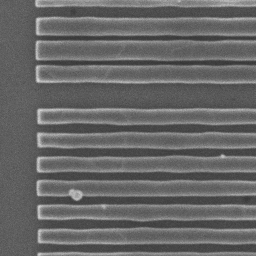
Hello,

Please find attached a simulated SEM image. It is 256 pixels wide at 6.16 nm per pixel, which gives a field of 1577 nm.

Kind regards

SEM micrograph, groups of lines, slits or small figures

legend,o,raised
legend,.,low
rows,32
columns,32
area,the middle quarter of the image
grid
........................oo......
oooooooooooooooooooooooooooooooo
oooooooooooooooooooooooooooooooo
oooooooooooooooooooooooooooooooo
..................ooo.........oo
................................
................................
................................
................................
................................
................................
oooooooooooooooooooooooooooooooo
oooooooooooooooooooooooooooooooo
oooooooooooooooooooooooooooooooo
o...oooooooooooooooooooooooooooo
................................
................................
............ooooooooooooooooo...
oooooooooooooooooooooooooooooooo
oooooooooooooooooooooooooooooooo
oooooooooooooooooooooooooooooooo
................................
................................
oooo....ooooo......ooooooooooooo
oooooooooooooooooooooooooooooooo
oooooooooooooooooooooooooooooooo
oooooooooooooooooooooooooooooooo
................................
................................
oooooooooooooooooooooooooooooooo
oooooooooooooooooooooooooooooooo
oooooooooooooooooooooooooooooooo